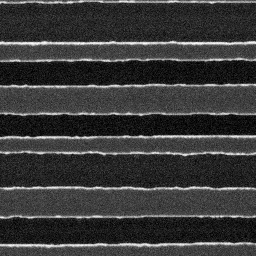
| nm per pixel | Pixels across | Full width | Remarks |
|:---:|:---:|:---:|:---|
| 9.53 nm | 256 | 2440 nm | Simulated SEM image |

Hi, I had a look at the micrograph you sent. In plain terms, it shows lines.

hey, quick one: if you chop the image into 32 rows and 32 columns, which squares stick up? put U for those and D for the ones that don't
DDDDDDDDDDDDDDDDDDDDDDDDDDDDDDDD
DDDDDDDDDDDDDDDDDDDDDDDDDDDDDDDD
DDDDDDDDDDDDDDDDDDDDDDDDDDDDDDDD
DDDDDDDDDDDDDDDDDDDDDDDDDDDDDDDD
DDDDDDDDDDDDDDDDDDDDDDDDDDDDDDDD
UUUUUUUUUUUUUUUUUUUUUUUUUUUUUUUU
UUUUUUUUUUUUUUUUUUUUUUUUUUUUUUUU
UUUUUUUUUUUUUUUUUUUDDDUUUUUUUDUU
DDDDDDDDDDDDDDDDDDDDDDDDDDDDDDDD
DDDDDDDDDDDDDDDDDDDDDDDDDDDDDDDD
DDDDDDDDDDDDDDDDDDDDDDDDDDDDDDDD
UUUUUUUUUUUUUUUUUUUUUUUUUUUUUUUU
UUUUUUUUUUUUUUUUUUUUUUUUUUUUUUUU
UUUUUUUUUUUUUUUUUUUUUUUUUUUUUUUU
DDDDDDDDDDDDDDDDDDDDDDDDDDDDDDDD
DDDDDDDDDDDDDDDDDDDDDDDDDDDDDDDD
DDDDDDDDDDDDDDDDDDDDDDDDDDDDDDDD
UUUUUUUUUUUUUUUUUUUUUUUUUUUUUUUU
UUUUUUUUUUUUUUUUUUUUUUUUUUUUUUUU
DDDDDDDDDDDDDDDDDDDDDDDDDDDDDDDD
DDDDDDDDDDDDDDDDDDDDDDDDDDDDDDDD
DDDDDDDDDDDDDDDDDDDDDDDDDDDDDDDD
DDDDDDDDDDDDDDDDDDDDDDDDDDDDDDDD
DUUDUUUUUUUUUDDUUDDDDDDDUUDDDDDD
UUUUUUUUUUUUUUUUUUUUUUUUUUUUUUUU
UUUUUUUUUUUUUUUUUUUUUUUUUUUUUUUU
UUUUUUUUUUUUUUUUUUUUUUUUUUUUUUUU
DDDDDDDDDDDDDDDDDDDDDDDDDDDDDDDD
DDDDDDDDDDDDDDDDDDDDDDDDDDDDDDDD
DDDDDDDDDDDDDDDDDDDDDDDDDDDDDDDD
DDDDDDDDDDDDDDDDDDDDDDDDUUUUUUUU
UUUUUUUUUUUUUUUUUUUUUUUUUUUUUUUU